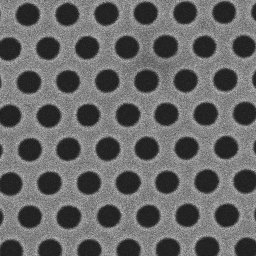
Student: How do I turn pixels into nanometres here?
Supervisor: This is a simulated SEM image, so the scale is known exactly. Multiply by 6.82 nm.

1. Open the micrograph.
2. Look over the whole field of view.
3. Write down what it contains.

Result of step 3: a regular array of holes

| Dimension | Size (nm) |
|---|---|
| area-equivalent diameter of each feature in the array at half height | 164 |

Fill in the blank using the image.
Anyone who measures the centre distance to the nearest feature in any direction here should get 38.8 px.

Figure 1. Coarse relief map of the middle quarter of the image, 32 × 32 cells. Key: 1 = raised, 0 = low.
11111111111111111111111111111111
11111111110011111111011111111000
00011111000001111100000111110000
00001111000000111100000011110000
00001111000000111000000011100000
00001111000000111100000111110000
00011111100001111100000111111000
11111111111111111111111111111111
11111111111111111111111111111111
11111111111111111111111110111111
11110000111111000011111000001111
11100000011110000001111000001111
11100000011110000001111000000111
11100000011110000001111000001111
11110000111110000011111000001111
11111001111111100111111110111111
11111111111111111111111111111111
11111111111111111111111111111111
00111111110011111110001111111000
00001111100000111100000111110000
00001111000000111100000011110000
00001111000000111100000011110000
00001111000000111100000011110000
00011111100001111110000111111000
11111111111111111111111111111111
11111111111111111111111111111111
11111111111111111111111111111111
11110000111111000011111100001111
11100000011110000001111000000111
11100000011110000001111000000111
11100000011110000001111000000111
11110000011110000001111000001111